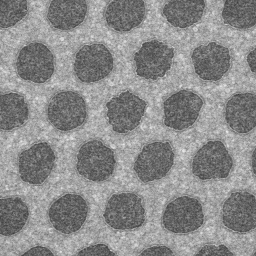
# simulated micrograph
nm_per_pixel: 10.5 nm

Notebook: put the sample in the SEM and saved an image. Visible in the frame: a regular array of raised bodies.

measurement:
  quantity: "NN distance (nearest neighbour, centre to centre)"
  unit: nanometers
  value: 599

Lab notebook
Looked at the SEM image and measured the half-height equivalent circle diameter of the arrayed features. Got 422 nanometres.